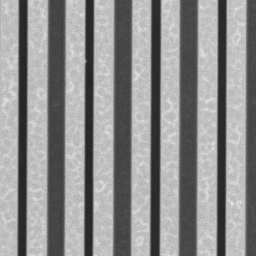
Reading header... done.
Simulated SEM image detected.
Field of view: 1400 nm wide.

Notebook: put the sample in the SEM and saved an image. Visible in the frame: parallel lines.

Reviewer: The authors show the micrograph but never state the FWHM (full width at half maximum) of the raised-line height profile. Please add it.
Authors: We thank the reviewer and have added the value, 120 nanometers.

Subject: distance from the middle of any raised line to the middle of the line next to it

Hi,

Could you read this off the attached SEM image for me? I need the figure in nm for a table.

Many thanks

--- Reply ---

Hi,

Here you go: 181